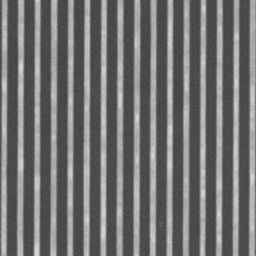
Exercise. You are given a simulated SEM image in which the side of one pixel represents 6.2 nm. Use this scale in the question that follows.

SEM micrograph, parallel lines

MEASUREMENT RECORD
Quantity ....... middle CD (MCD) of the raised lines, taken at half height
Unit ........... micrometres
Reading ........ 0.0333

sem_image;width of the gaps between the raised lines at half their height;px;11.6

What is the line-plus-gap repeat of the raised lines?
0.103 microns